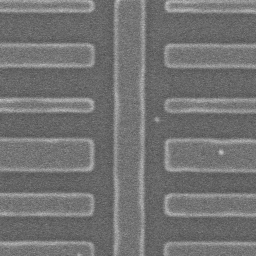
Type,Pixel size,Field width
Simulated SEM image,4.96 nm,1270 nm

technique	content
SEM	groups of lines, slits or small figures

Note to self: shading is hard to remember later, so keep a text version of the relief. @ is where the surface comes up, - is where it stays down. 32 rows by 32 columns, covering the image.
@@@@@@@@@@@@--@@@@---@@@@@@@@@@@
--------------@@@@--------------
--------------@@@@--------------
--------------@@@@--------------
--------------@@@@--------------
--------------@@@@--------------
@@@@@@@@@@@@--@@@@---@@@@@@@@@@@
@@@@@@@@@@@@--@@@@---@@@@@@@@@@@
--------------@@@@--------------
--------------@@@@--------------
--------------@@@@--------------
--------------@@@@--------------
@@@@@@@@@@@---@@@@---@@@@-@@@@@@
@@@@@@@@@@@@--@@@@---@@@@@@@@@@@
--------------@@@@--------------
--------------@@@@--------------
--------------@@@@--------------
@@@@@@@@@@@---@@@@---@@@@@------
@@@@@@@@@@@@--@@@@---@@@@@@@@@@@
@@@@@@@@@@@@--@@@@---@@@@@@@@@@@
@@@@@@@@@@@@--@@@@---@@@@@@@@@@@
--------------@@@@--------------
--------------@@@@--------------
--------------@@@@--------------
@@@@@@@@@@@---@@@@---@@@@@@@@@@@
@@@@@@@@@@@@--@@@@---@@@@@@@@@@@
@@@@@@@@@@@@--@@@@---@@@@@@@@@@@
--------------@@@@--------------
--------------@@@@--------------
--------------@@@@--------------
@@@@@@@@@@@---@@@@---@@@@@@@@@@@
@@@@@@@@@@@@--@@@@---@@@@@@@@@@@